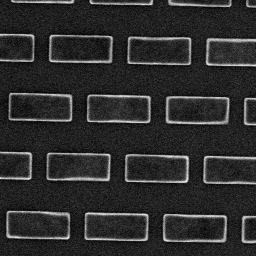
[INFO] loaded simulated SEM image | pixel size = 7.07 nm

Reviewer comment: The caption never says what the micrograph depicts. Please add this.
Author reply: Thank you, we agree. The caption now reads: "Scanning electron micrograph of groups of lines, slits or small figures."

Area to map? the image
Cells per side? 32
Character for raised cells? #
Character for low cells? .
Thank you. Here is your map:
......................#######..#
................................
................................
................................
####...##.......................
####..########..########..######
####..########..########..######
####..########..########..######
................................
................................
................................
................................
.########..########..########..#
.########..########..########..#
.########..########..#######...#
...............................#
................................
................................
................................
####..########..#####...........
####..########..#######...######
####..########..#######...######
................#######...######
................................
................................
................................
.#..............................
.########..#######..########..##
.########..#######..########..##
.########..#######..########..##
................................
................................